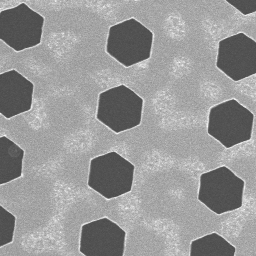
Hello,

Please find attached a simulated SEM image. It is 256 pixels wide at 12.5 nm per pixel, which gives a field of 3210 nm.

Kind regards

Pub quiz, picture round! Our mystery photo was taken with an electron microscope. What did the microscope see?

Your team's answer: holes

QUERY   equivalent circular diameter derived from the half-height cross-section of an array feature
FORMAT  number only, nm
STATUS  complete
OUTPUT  569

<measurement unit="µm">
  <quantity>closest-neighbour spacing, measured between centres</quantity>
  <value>0.843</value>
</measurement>